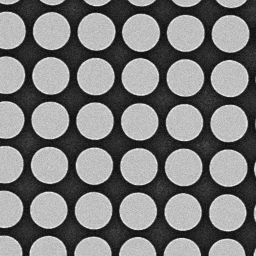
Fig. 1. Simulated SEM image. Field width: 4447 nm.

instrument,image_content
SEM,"an array of small figures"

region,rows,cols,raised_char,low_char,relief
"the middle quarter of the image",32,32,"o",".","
o...oooooooo....ooooooo....ooooo
o...oooooooo...oooooooo...oooooo
o..ooooooooo...ooooooooo..oooooo
o..oooooooooo..ooooooooo..oooooo
o..ooooooooo...ooooooooo..oooooo
....oooooooo...oooooooo...oooooo
.....oooooo.....oooooo.....ooooo
......oooo........ooo.......oooo
................................
................................
.....ooooo.......oooo.......oooo
....ooooooo....oooooooo....ooooo
o...oooooooo...oooooooo...oooooo
o..ooooooooo..ooooooooo...oooooo
o..ooooooooo..ooooooooo...oooooo
o..ooooooooo..ooooooooo...oooooo
o...oooooooo...oooooooo...oooooo
....ooooooo....ooooooo.....ooooo
......oooo.......oooo.......oooo
................................
................................
.....ooooo.......oooo.......oooo
....ooooooo....ooooooo.....ooooo
o...oooooooo...oooooooo...oooooo
o..ooooooooo..ooooooooo...oooooo
o..ooooooooo..ooooooooo..ooooooo
o..ooooooooo..ooooooooo..ooooooo
....oooooooo...oooooooo...oooooo
....ooooooo....ooooooo....oooooo
......oooo......ooooo......ooooo
................................
................................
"